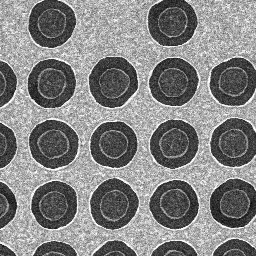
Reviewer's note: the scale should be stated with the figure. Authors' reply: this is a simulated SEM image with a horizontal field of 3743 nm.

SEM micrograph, a regular array of ring-shaped grooves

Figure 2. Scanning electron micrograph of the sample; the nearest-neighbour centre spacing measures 888 nm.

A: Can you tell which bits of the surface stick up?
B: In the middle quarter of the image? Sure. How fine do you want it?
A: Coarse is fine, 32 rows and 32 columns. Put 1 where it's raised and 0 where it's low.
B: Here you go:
00111111000000000111111000000000
00111110000111000011110000111000
00011100001111100011110011111100
00011100011111110011100011111110
00011100011111110001100011111110
00011100011111110001100011111110
00011100011111100011100011111100
00111110001111000011110001111100
00111110000110000111110000000000
01111111000000001111111100000001
11111111100000111111111111000011
11111111111111111111111111111111
11111111111111111111111111111111
11111111111111111111111111111111
11111111110000011111111110000011
00111111100000001111111000000000
00111111000000000111111000011000
00011110001111100011110001111110
10001110011111110011110011111110
10001100011111110011100011111110
10001100011111110011100011111110
10001100011111110011100011111110
00011110001111100011110001111100
00011110000010000111110000000000
00111111000000000111111000000000
01111111110000011111111110000011
11111111111111111111111111111111
11111111111111111111111111111111
11111111111111111111111111111111
11111111110000001111111110000011
00111111100000000111111100000000
00011111000000000111111000001000